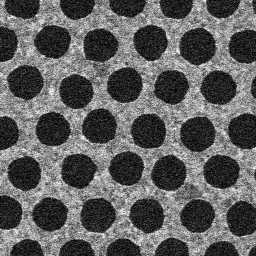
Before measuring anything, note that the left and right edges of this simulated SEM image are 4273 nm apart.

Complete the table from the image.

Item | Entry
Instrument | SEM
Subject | a regular array of holes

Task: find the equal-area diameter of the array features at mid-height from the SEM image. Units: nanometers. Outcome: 597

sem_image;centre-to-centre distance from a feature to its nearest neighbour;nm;780